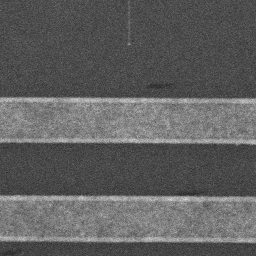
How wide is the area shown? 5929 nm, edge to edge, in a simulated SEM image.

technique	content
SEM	one or a few lines or trenches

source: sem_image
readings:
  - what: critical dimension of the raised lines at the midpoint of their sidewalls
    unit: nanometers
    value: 946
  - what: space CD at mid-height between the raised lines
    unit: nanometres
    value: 1330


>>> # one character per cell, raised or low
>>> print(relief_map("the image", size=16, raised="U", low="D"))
DDDDDDDDDDDDDDDD
DDDDDDDDDDDDDDDD
DDDDDDDDDDDDDDDD
DDDDDDDDDDDDDDDD
DDDDDDDDDDDDDDDD
DDDDDDDDDDDDDDDD
UUUUUUUUUUUUUUUU
UUUUUUUUUUUUUUUU
UUUUUUUUUUUUUUUU
DDDDDDDDDDDDDDDD
DDDDDDDDDDDDDDDD
DDDDDDDDDDDDDDDD
UUUUUUUUUUUUUUUU
UUUUUUUUUUUUUUUU
UUUUUUUUUUUUUUUU
DDDDDDDDDDDDDDDD